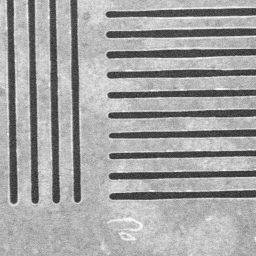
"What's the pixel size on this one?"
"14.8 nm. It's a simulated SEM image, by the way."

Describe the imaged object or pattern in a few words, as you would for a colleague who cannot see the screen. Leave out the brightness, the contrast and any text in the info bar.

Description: groups of lines, slits or small figures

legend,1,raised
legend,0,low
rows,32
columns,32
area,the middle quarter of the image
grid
11001111111111111111111111111111
11001111111111111111110000000000
11001111111000000000000000000000
11001111111000000000000000000000
11001111111111111111111111111111
11001111111111111111111111111111
11001111111111111111111111100000
11001111111000000000000000000000
11001111111000000000000000000000
11001111111111111111111111111111
11001111111111111111111111111111
11001111111111111111111111111111
11001111111000000000000000000000
11001111111000000000000000000000
11001111111111111111111111111111
11001111111111111111111111111111
11001111111111111111111111111111
11001111111000000000000000000000
11001111111000000000000000000000
11001111111111111111111111111111
11001111111111111111111111111111
11001111111111111111111111111111
11001111111000000000000000000000
11001111111000000000000000000000
11001111111111111111111111111111
11001111111111111111111111111111
11001111111111111111111111111111
11001111111000000000000000000000
11001111111000000000000000000000
11001111111111111111111111111111
11001111111111111111111111111111
11001111111111111111111111111111